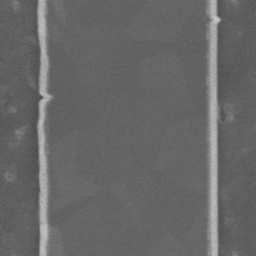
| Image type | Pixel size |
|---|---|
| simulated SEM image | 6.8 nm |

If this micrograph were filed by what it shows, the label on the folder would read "one or a few lines or trenches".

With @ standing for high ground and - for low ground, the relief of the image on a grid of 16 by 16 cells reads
---@@@@@@@@@@---
---@@@@@@@@@@---
---@@@@@@@@@@---
---@@@@@@@@@@---
---@@@@@@@@@@---
---@@@@@@@@@@---
---@@@@@@@@@@---
---@@@@@@@@@@---
---@@@@@@@@@@---
---@@@@@@@@@@---
---@@@@@@@@@@---
---@@@@@@@@@@---
---@@@@@@@@@@---
---@@@@@@@@@@---
---@@@@@@@@@@---
---@@@@@@@@@@---